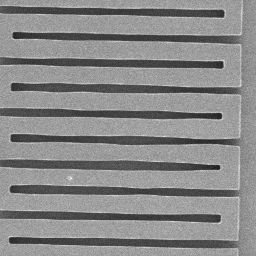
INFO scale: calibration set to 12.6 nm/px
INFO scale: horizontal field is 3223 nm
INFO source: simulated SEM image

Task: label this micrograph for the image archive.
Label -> groups of lines, slits or small figures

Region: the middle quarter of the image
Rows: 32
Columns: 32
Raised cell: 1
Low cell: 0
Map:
00000000000000000000000000000000
11111111111111111111111111111111
11111111111111111111111111111111
11111111111111111111111111111111
11111111111111111111111111111111
00000000000000000000000000000111
00000000000000000000000000000000
11111111111111111111111111111111
11111111111111111111111111111111
11111111111111111111111111111111
11111111111111111111111111111111
00000000000000000000000011111111
00000000000000000000000000000000
11111111111100000000000000000000
11111111111111111111111111111111
11111111111111111111111111111111
11111111111111111111111111111111
11111111111111111111111111111111
00000000000000000000000000000001
00000000000000000000000000000000
11111111111111111111111111111111
11111111111111111111111111111111
11111111111111111111111111111111
11111111111111111111111111111111
00000000000000000000000000001111
00000000000000000000000000000000
11111000000000000000000000000000
11111111111111111111111111111111
11111111111111111111111111111111
11111111111111111111111111111111
00000000000111111111111111111111
00000000000000000000000000000000